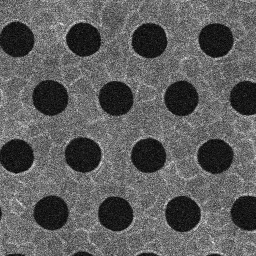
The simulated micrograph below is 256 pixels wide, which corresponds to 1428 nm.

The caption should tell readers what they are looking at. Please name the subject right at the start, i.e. a regular array of holes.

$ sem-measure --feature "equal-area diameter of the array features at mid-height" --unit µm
0.194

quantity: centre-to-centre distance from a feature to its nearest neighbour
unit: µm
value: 0.367